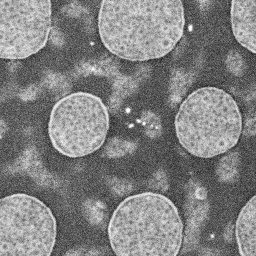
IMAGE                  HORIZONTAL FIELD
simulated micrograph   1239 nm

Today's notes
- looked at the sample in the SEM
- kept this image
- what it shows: raised bodies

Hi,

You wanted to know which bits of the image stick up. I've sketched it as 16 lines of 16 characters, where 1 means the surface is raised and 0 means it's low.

1110001111100001
1110001111100001
1110001111100001
1100000111000000
0000000000000000
0000000000000000
0000110000011110
0001111000011110
0001111000011110
0000110000001100
0000000000000000
0000000000000000
1100000011000000
1110000111100001
1110000111100001
1110000111100001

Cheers